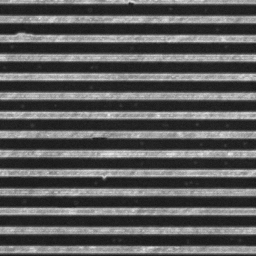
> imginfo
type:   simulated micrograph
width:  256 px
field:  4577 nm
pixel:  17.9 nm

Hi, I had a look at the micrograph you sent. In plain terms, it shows parallel lines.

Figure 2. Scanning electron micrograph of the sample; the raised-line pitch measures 0.344 microns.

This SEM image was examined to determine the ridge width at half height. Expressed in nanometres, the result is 138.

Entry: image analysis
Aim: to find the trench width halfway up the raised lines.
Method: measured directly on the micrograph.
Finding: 210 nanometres